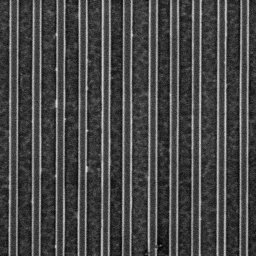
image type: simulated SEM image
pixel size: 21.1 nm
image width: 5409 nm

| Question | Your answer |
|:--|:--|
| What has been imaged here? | parallel lines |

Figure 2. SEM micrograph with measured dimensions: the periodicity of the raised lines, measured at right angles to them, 487 nm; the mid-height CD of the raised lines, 174 nm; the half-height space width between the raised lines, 0.312 microns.